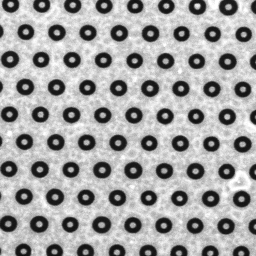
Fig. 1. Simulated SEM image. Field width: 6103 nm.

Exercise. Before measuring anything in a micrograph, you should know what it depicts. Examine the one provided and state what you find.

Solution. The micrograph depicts a regular array of ring-shaped grooves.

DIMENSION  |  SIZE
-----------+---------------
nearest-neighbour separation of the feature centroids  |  737 nm